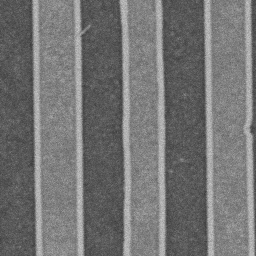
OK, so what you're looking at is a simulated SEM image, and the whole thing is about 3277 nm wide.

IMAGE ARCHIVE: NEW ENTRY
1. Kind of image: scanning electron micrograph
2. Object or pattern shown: one or a few lines or trenches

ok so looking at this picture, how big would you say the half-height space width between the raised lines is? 0.603 µm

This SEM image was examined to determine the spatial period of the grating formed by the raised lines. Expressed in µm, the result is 1.1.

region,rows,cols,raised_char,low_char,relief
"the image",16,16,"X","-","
--XXX---XX---XX-
--XXX---XX---XXX
--XXX---XX---XXX
--XXX---XX---XXX
--XXX---XX---XXX
--XXX---XX---XXX
--XXX---XX---XXX
--XXX---XX---XXX
--XXX---XX---XXX
--XXX---XX---XXX
--XXX---XX---XXX
--XXX---XX---XXX
--XXX---XX---XXX
--XXX---XX---XXX
--XXX---XX---XXX
--XXX---XX---XXX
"